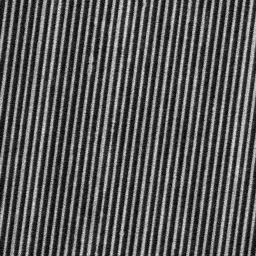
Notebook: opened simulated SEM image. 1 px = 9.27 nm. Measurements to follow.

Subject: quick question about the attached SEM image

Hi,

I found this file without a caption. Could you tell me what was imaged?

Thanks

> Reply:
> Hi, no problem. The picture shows parallel lines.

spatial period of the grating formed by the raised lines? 0.0702 micrometres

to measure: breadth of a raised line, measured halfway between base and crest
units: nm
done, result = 24.1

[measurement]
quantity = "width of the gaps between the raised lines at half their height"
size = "47.1 nanometres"